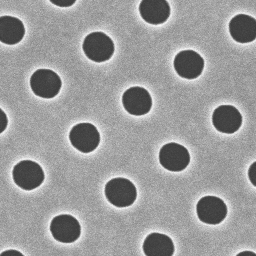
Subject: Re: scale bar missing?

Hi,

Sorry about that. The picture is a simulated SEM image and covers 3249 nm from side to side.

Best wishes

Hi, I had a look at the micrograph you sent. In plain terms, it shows a regular array of holes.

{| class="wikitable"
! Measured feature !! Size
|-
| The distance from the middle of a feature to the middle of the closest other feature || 0.815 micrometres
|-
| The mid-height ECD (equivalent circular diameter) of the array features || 382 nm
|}